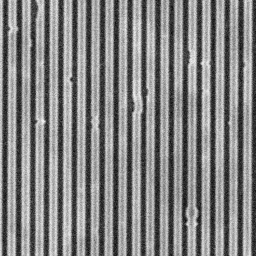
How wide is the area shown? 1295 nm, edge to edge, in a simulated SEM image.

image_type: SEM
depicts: parallel lines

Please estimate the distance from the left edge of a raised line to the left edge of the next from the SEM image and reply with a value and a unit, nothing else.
13.9 pixels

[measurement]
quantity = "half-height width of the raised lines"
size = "0.0367 micrometres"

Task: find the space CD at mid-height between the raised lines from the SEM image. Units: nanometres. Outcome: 36.7